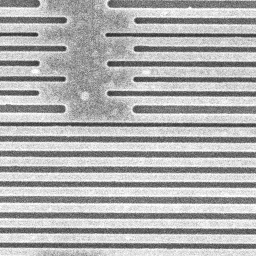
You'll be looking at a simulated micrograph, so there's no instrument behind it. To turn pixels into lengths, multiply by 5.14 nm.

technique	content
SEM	parallel lines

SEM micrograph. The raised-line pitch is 0.0778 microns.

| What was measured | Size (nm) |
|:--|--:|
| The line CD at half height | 44.4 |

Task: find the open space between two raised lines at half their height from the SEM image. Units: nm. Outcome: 34.1